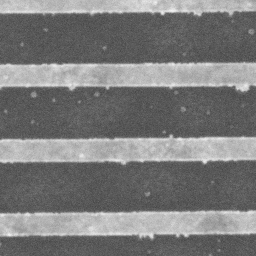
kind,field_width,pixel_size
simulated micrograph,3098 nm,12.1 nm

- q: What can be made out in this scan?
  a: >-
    lines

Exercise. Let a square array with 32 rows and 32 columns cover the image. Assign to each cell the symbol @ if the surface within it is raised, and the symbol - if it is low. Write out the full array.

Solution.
@@@@@@@@@@@@@@@@@@@@@@@@@@@@@@@@
@@@@@@@@@--@@--@----@---@@--@---
--------------------------------
--------------------------------
--------------------------------
--------------------------------
--------------------------------
--------------------------------
@@@@@@@@@@@@@@@@@@@@@@@@@@@@@@@@
@@@@@@@@@@@@@@@@@@@@@@@@@@@@@@@@
@@@@@@@@@@@@@@@@@@@@@@@@@@@@@@@@
--------------------------------
--------------------------------
--------------------------------
--------------------------------
--------------------------------
--------------------------------
@@@@@@@@@@@@@@@@@@@@@@@@@@@@@@@@
@@@@@@@@@@@@@@@@@@@@@@@@@@@@@@@@
@@@@@@@@@@@@@@@@@@@@@@@@@@@@@@@@
--------------------------------
--------------------------------
--------------------------------
--------------------------------
--------------------------------
--------------------------------
-------------------------@@@@@-@
@@@@@@@@@@@@@@@@@@@@@@@@@@@@@@@@
@@@@@@@@@@@@@@@@@@@@@@@@@@@@@@@@
--------------------------------
--------------------------------
--------------------------------